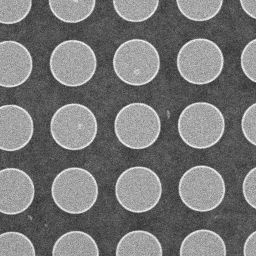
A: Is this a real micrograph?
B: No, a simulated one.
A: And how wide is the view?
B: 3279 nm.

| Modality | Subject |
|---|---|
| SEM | an array of small figures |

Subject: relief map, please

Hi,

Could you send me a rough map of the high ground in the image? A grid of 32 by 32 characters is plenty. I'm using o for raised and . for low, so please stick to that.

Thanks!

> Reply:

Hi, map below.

oooo..oooooo..oooooo..oooooo..oo
oooo...oooo....oooo....oooo....o
ooo.....oo......oo......oo......
................................
................................
oo......ooo....oooo....oooo....o
oooo...ooooo...ooooo..oooooo..oo
oooo..oooooo..oooooo..oooooo..oo
oooo..oooooo..oooooo..oooooo..oo
oooo...oooo....oooo....oooo....o
ooo.....oo......oo......o.......
................................
................................
ooo.....ooo....oooo....oooo....o
oooo...ooooo...ooooo...ooooo..oo
oooo..oooooo..oooooo..oooooo..oo
oooo..oooooo..oooooo..oooooo..oo
oooo...ooooo...oooo....oooo....o
ooo.....oo......oo......oo......
................................
................................
ooo.....ooo.....ooo....oooo....o
oooo...ooooo...ooooo...ooooo...o
oooo...ooooo...ooooo..oooooo..oo
oooo...ooooo...ooooo...ooooo...o
oooo...ooooo...ooooo...oooo....o
ooo.....oo.......o..............
................................
................................
ooo.....ooo.....ooo....oooo....o
oooo...ooooo...ooooo...ooooo...o
oooo...ooooo...ooooo...ooooo...o